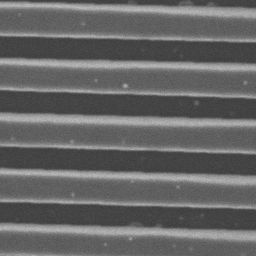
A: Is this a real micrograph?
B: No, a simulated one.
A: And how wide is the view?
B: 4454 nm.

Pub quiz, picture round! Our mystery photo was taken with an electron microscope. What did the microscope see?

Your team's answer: lines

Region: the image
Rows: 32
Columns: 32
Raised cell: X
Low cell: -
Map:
XXXXXXX-------------------------
XXXXXXXXXXXXXXXXXXXXXXXXXXXXXXXX
XXXXXXXXXXXXXXXXXXXXXXXXXXXXXXXX
XXXXXXXXXXXXXXXXXXXXXXXXXXXXXXXX
-----XXXXXXXXXXXXXXXXXXXXXXXXXXX
--------------------------------
--------------------------------
--------------------------------
XXXXXXXXXXXXXXXXXXXXXXXXXXXXXXXX
XXXXXXXXXXXXXXXXXXXXXXXXXXXXXXXX
XXXXXXXXXXXXXXXXXXXXXXXXXXXXXXXX
----------XXXXXXXXXXXXXXXXXXXXXX
--------------------------------
--------------------------------
XXXXX---------------------------
XXXXXXXXXXXXXXXXXXXXXXXXXXXXXXXX
XXXXXXXXXXXXXXXXXXXXXXXXXXXXXXXX
XXXXXXXXXXXXXXXXXXXXXXXXXXXXXXXX
-----------XXXXXXXXXXXXXXXXXXXXX
--------------------------------
--------------------------------
XXXXXXXX------------------------
XXXXXXXXXXXXXXXXXXXXXXXXXXXXXXXX
XXXXXXXXXXXXXXXXXXXXXXXXXXXXXXXX
XXXXXXXXXXXXXXXXXXXXXXXXXXXXXXXX
-------------XXXXXXXXXXXXXXXXXXX
--------------------------------
--------------------------------
XXXXXXXXXXXX--------------------
XXXXXXXXXXXXXXXXXXXXXXXXXXXXXXXX
XXXXXXXXXXXXXXXXXXXXXXXXXXXXXXXX
XXXXXXXXXXXXXXXXXXXXXXXXXXXXXXXX